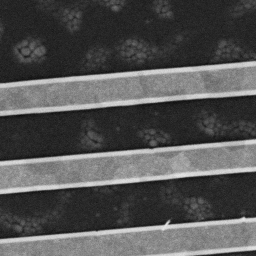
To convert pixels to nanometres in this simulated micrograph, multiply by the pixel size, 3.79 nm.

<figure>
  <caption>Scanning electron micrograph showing one or a few lines or trenches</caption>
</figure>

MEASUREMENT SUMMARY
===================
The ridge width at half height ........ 0.108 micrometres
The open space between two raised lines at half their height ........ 0.187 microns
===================